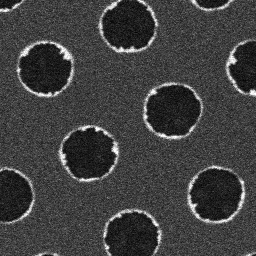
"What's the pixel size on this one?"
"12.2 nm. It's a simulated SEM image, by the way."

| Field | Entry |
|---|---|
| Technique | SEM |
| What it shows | holes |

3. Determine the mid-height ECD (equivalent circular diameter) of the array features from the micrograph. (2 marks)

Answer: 52.1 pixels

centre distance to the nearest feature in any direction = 1150 nm